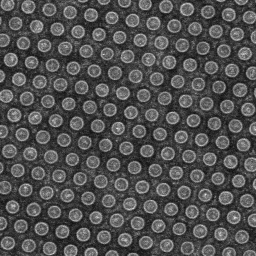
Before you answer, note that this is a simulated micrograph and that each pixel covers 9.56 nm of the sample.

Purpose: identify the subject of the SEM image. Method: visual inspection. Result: a regular array of raised bodies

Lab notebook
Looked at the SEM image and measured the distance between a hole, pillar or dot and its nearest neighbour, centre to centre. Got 20.8 pixels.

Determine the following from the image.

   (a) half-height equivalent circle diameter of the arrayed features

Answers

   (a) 0.124 microns